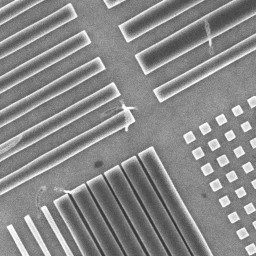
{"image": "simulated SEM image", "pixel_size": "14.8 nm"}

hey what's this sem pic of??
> groups of lines, slits or small figures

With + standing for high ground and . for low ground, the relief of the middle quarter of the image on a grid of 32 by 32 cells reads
.....+++++.........+++++........
...+++++++..........++..........
.+++++++......................++
++++++......................++++
++++......................++++++
+++........++...........+++++++.
+........++++..........++++++...
.......+++++++.........++++.....
......+++++++..........+++......
....+++++++.....................
..+++++++.......................
+++++++........+................
+++++........++++...............
++++........+++++...............
++........+++++++...............
........++++++++................
.......++++++...................
.....+++++++...................+
...+++++++....................++
.+++++++........................
++++++..........................
+++++................+..........
+++................++++.........
+................+.++++.........
...............+++..++++........
..............+++++.+++++.......
............++.+++++.++++.......
..........+++++.++++.+++++......
........++.++++.+++++.++++......
......++++.+++++.++++.+++++.....
....+.+++++.++++.+++++.++++.....
...+++.++++++++++.++++..++++....